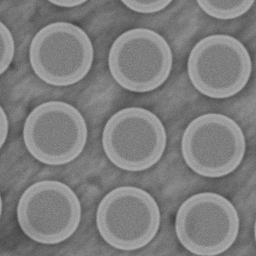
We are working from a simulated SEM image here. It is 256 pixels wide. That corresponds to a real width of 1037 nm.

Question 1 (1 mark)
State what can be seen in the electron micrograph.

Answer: an array of small figures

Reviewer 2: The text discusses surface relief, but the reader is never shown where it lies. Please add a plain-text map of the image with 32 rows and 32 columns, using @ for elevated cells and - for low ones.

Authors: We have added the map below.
-------@@@------@@@@@----@@@@@@-
-----------------@@-------@@@@@-
--------------------------------
@----@@@@@----------------------
@---@@@@@@@----@@@@@------@@----
@@--@@@@@@@---@@@@@@@----@@@@@--
@@--@@@@@@@@--@@@@@@@---@@@@@@@-
@---@@@@@@@@--@@@@@@@---@@@@@@@-
@---@@@@@@@---@@@@@@@---@@@@@@@-
-----@@@@@----@@@@@@@---@@@@@@@-
------@@@------@@@@@----@@@@@@@-
-------------------------@@@@@--
--------------------------------
-----@@@@-----------------------
@---@@@@@@----@@@@@------@@@----
@--@@@@@@@@--@@@@@@@----@@@@@@--
@--@@@@@@@@--@@@@@@@@--@@@@@@@--
@--@@@@@@@@--@@@@@@@@--@@@@@@@@-
---@@@@@@@---@@@@@@@@--@@@@@@@@-
----@@@@@@---@@@@@@@---@@@@@@@--
------@@------@@@@@----@@@@@@@--
-------------------------@@@@---
--------------------------------
----@@@@@------@@---------------
---@@@@@@----@@@@@@-----@@@@----
--@@@@@@@@---@@@@@@@---@@@@@@---
--@@@@@@@@--@@@@@@@@--@@@@@@@---
--@@@@@@@@--@@@@@@@@--@@@@@@@@--
---@@@@@@@--@@@@@@@@--@@@@@@@@--
----@@@@@----@@@@@@---@@@@@@@@--
--------------@@@@-----@@@@@@---
------------------------@@@@----